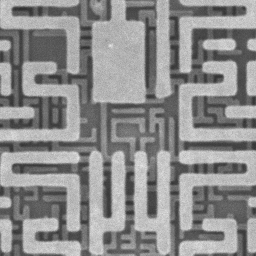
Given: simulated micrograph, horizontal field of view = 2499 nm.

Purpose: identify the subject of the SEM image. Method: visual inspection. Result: wiring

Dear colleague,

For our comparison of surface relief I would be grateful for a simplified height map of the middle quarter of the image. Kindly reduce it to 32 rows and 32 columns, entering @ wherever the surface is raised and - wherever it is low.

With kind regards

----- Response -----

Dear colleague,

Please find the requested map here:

-@@@---@@@@@@@@@@@@@---@@@---@@@
-@@@---@@@@@@@@@@@@@---@@@---@@@
-------@@@@@@@@@@@@@---@@@------
-------@@@@@@@@@@@@@---@@@------
-------@@@@@@@@@@@@@---@@@------
@@@----@@@@@@@@@@@@@---@@@@--@@@
@@@----@@@@@@@@@@@@@---@@@@--@@@
@@@----@@@@@@@@@@@@@---@@@@--@@@
-@@----@@@@@@@@@@@@@---------@@@
-@@@-------@@@@@@@@@---------@@@
-@@@-------------------------@@@
-@@@-------------------------@@@
-@@@-------------------------@@@
-@@@-------------------------@@@
-@@@-------------------------@@@
-@@@-------------------------@@@
@@@@-------------------------@@@
@@@@-------------------------@@@
@@@--------------------------@@@
--------------------------------
--------------------------------
--------------------------------
@@@----@@----@@---@@----@@---@@@
@@@@---@@---@@@---@@@---@@---@@@
@@@----@@@--@@@---@@@---@@---@@@
-------@@@--@@@---@@@---@@------
-------@@@--@@@---@@@---@@------
-------@@@--@@@---@@----@@----@-
@@@@---@@@--@@@---@@----@@---@@@
@@@@---@@@--@@@---@@----@@---@@@
@@@@---@@@--@@@---@@----@@---@@@
-@@@---@@@--@@@---@@----@@---@@@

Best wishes